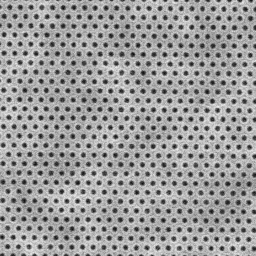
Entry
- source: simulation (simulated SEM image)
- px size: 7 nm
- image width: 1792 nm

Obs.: a regular array of holes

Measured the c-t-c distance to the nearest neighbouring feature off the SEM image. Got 72.8 nm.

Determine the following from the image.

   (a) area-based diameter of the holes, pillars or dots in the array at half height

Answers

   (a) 44.7 nanometres